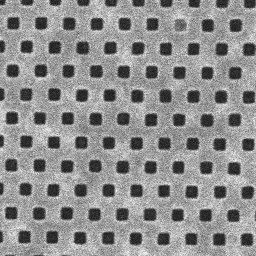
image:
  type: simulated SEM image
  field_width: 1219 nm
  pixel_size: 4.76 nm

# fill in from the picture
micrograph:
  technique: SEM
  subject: a regular array of holes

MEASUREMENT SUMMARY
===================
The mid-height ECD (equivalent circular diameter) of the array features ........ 63.8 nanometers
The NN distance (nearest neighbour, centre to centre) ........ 129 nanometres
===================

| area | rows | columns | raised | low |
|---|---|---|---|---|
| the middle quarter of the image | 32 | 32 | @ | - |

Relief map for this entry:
--@@@@@--@@@@@--@@@@@--@@@@@@@@@
---@@@----@@@---@@@@----@@@----@
---@@@----@@@---@@@@----@@@---@@
@@@@@@@--@@@@@--@@@@@--@@@@---@@
@@@@@@@@@@@@@@@@@@@@@@@@@@@@@@@@
@@@@@@@@@@@@@@@@@@@@@@@@@@@@@@@@
@@@---@@@@--@@@@@@-@@@@@--@@@@@@
@@@---@@@@---@@@@---@@@@---@@@@-
@@@---@@@@---@@@@---@@@@---@@@@-
@@@@@@@@@@--@@@@@--@@@@@--@@@@@-
@@@@@@@@@@@@@@@@@@@@@@@@@@@@@@@@
@@@@@@@@@@@@@@@@@@@@@@@@@@@@@@@@
--@@@@@--@@@@@--@@@@@--@@@@@-@@@
---@@@----@@@----@@@---@@@@---@@
--@@@@----@@@---@@@@---@@@@---@@
@@@@@@@@-@@@@@@@@@@@@--@@@@@--@@
@@@@@@@@@@@@@@@@@@@@@@@@@@@@@@@@
@@@@@@@@@@@@@@@@@@@@@@@@@@@@@@@@
@@@---@@@@--@@@@@--@@@@@--@@@@@-
@@@---@@@@---@@@----@@@@---@@@@-
@@@---@@@@---@@@----@@@@---@@@--
@@@@@@@@@@--@@@@@--@@@@@@@@@@@@-
@@@@@@@@@@@@@@@@@@@@@@@@@@@@@@@@
@@@@@@@@@@@@@@@@@@@@@@@@@@@@@@@@
--@@@@@--@@@@---@@@@@--@@@@---@@
--@@@@---@@@@---@@@@---@@@@---@@
--@@@@---@@@@---@@@@---@@@@---@@
@@@@@@@@@@@@@@@@@@@@@@@@@@@@@@@@
@@@@@@@@@@@@@@@@@@@@@@@@@@@@@@@@
@@@@@@@@@@@@@@@@@@@@@@@@@@@@@@@@
@@@---@@@@---@@@@---@@@@--@@@@@-
@@@---@@@@---@@@@---@@@----@@@--